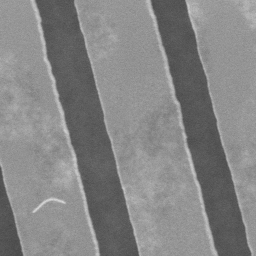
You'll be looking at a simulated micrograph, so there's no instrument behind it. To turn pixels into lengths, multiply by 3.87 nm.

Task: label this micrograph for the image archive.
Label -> lines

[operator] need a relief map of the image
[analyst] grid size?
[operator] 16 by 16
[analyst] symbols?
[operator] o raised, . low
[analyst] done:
oo...ooooo..oooo
ooo..ooooo..oooo
ooo..ooooo..oooo
ooo...oooo..oooo
ooo...ooooo..ooo
oooo..ooooo..ooo
oooo..ooooo..ooo
oooo...oooo...oo
oooo...ooooo..oo
ooooo..ooooo..oo
ooooo..ooooo..oo
ooooo...oooo...o
.oooo...ooooo..o
.ooooo..ooooo..o
.ooooo..ooooo..o
.ooooo...oooo...